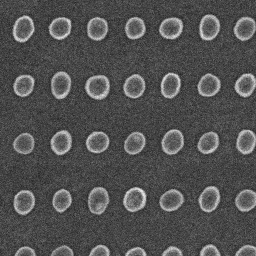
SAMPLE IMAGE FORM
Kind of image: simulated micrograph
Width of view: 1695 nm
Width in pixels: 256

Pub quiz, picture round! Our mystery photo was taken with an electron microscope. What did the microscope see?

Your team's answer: a regular array of raised bodies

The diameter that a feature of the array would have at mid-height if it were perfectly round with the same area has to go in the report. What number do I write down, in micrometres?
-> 0.144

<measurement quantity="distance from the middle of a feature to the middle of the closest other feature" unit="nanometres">241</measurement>